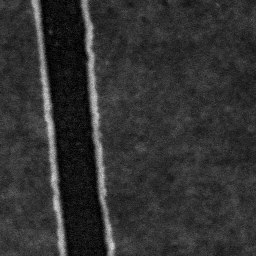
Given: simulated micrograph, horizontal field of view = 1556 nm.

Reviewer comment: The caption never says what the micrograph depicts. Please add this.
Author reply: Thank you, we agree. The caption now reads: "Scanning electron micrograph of one or a few lines or trenches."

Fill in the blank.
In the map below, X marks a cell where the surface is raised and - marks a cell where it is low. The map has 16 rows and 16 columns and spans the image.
XX---XXXXXXXXXXX
XX---XXXXXXXXXXX
XXX---XXXXXXXXXX
XXX---XXXXXXXXXX
XXX---XXXXXXXXXX
XXX---XXXXXXXXXX
XXX---XXXXXXXXXX
XXX---XXXXXXXXXX
XXX---XXXXXXXXXX
XXX---XXXXXXXXXX
XXX---XXXXXXXXXX
XXX---XXXXXXXXXX
XXXX--XXXXXXXXXX
XXXX---XXXXXXXXX
XXXX---XXXXXXXXX
XXXX---XXXXXXXXX